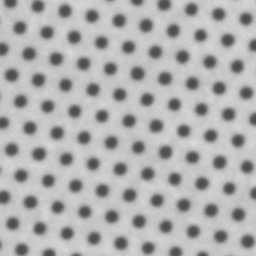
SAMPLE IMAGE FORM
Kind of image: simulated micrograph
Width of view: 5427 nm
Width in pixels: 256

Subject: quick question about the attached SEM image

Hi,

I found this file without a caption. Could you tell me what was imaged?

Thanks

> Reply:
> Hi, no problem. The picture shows a regular array of holes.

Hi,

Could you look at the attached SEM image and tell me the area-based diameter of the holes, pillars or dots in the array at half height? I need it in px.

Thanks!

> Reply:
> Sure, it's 13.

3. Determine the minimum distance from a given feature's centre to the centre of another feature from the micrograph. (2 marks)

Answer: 583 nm